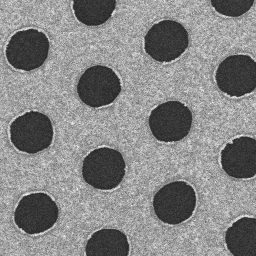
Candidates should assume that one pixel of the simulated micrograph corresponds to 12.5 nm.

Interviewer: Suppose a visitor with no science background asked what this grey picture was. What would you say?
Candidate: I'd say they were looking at a regular array of holes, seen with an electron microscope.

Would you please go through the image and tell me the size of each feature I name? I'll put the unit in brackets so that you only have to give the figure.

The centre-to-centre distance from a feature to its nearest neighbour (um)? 0.998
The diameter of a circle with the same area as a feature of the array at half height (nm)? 532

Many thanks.